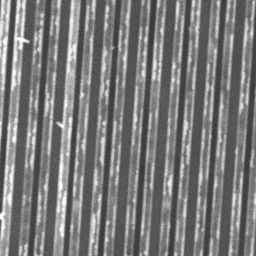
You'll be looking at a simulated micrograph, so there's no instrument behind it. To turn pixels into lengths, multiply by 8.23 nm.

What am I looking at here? parallel lines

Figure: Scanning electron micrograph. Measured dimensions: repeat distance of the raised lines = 0.145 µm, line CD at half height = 71.9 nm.